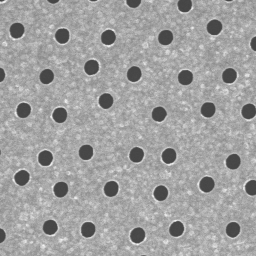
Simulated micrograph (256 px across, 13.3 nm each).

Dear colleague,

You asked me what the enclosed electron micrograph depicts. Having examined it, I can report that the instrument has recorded a regular array of holes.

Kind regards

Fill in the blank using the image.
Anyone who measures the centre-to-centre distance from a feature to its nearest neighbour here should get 514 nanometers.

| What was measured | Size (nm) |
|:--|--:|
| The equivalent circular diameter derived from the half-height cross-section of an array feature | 207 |